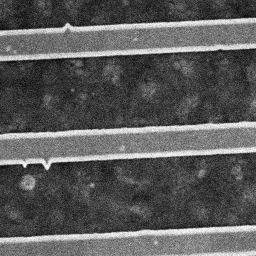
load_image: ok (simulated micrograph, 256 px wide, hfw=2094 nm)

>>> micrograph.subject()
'one or a few lines or trenches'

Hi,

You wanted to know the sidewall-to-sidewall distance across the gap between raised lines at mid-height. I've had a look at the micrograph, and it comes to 629 nanometres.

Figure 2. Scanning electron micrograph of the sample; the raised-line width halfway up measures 220 nm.